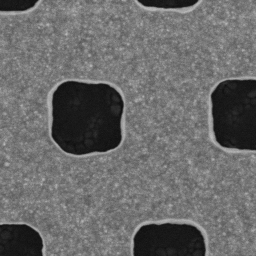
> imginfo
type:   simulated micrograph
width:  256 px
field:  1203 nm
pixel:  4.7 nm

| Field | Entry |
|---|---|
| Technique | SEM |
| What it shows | holes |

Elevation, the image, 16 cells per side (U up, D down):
DDUUUUUUUUDDUUUU
UUUUUUUUUUUUUUUU
UUUUUUUUUUUUUUUU
UUUUUUUUUUUUUUUU
UUUUUUUUUUUUUUUU
UUUUDDDUUUUUUDDD
UUUDDDDDUUUUUDDD
UUUDDDDDUUUUUDDD
UUUDDDDDUUUUUDDD
UUUUDDUUUUUUUUUU
UUUUUUUUUUUUUUUU
UUUUUUUUUUUUUUUU
UUUUUUUUUUUUUUUU
UUUUUUUUUUUUUUUU
DDUUUUUUUDDDDUUU
DDDUUUUUDDDDDUUU